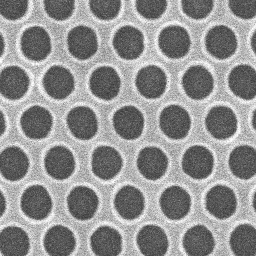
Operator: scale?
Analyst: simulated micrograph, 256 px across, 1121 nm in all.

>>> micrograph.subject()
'a regular array of holes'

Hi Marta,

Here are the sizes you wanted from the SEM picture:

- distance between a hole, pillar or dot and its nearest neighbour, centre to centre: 200 nanometers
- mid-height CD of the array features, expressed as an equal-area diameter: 0.151 microns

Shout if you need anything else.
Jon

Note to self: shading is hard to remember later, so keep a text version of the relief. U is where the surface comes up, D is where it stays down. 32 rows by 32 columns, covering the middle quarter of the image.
UUUUUUUUUDDUUUUUUUUUDDDDUUUUUUUD
DUUUUUUUDDDDDUUUUUUDDDDDDUUUUUUD
DDUUUUUDDDDDDDUUUUDDDDDDDDUUUUDD
DDDUUUDDDDDDDDUUUUDDDDDDDDUUUDDD
DDDUUUDDDDDDDDUUUUDDDDDDDDUUUDDD
DDDUUUDDDDDDDDUUUUDDDDDDDDUUUDDD
DDDUUUDDDDDDDDUUUUDDDDDDDDUUUUDD
DDUUUUUDDDDDDDUUUUUDDDDDDUUUUUDD
DUUUUUUUDDDDDUUUUUUUDDDDUUUUUUUD
UUUUUUUUUUUUUUUUUUUUUUUUUUUUUUUU
UUUDDDUUUUUUUUUDDUUUUUUUUDDDDDUU
UDDDDDDUUUUUUDDDDDDUUUUUDDDDDDDU
UDDDDDDDUUUUDDDDDDDDUUUUDDDDDDDU
DDDDDDDDDUUUDDDDDDDDUUUUDDDDDDDD
DDDDDDDDDUUUDDDDDDDDUUUDDDDDDDDD
UDDDDDDDDUUUDDDDDDDDUUUUDDDDDDDD
UDDDDDDDDUUUDDDDDDDDUUUUDDDDDDDU
UUDDDDDDUUUUUDDDDDDDUUUUUDDDDDDU
UUUDDDDUUUUUUUDDDDDUUUUUUUDDDDDU
UUUUUUUUUUUUUUUUUUUUUUUUUUUUUUUU
UUUUUUUUDDDDUUUUUUUUUDUUUUUUUUUU
DDUUUUUDDDDDDUUUUUUDDDDDUUUUUUUD
DDUUUUUDDDDDDDUUUUDDDDDDDUUUUUDD
DDDUUUUDDDDDDDDUUUDDDDDDDDUUUDDD
DDDUUUUDDDDDDDDUUUDDDDDDDDUUUDDD
DDDUUUUDDDDDDDDUUUDDDDDDDDUUUDDD
DDDUUUUDDDDDDDUUUUUDDDDDDDUUUUDD
DDUUUUUDDDDDDDUUUUUDDDDDDUUUUUDD
DUUUUUUUUDDDDUUUUUUUDDDDUUUUUUUU
UUUUUUUUUUUUUUUUUUUUUUUUUUUUUUUU
UUUDDDUUUUUUUUDDDDUUUUUUUUDDDUUU
UDDDDDDUUUUUUDDDDDDUUUUUUDDDDDDU